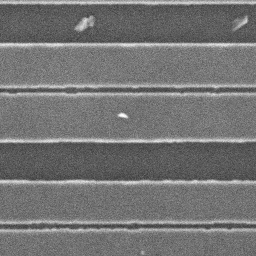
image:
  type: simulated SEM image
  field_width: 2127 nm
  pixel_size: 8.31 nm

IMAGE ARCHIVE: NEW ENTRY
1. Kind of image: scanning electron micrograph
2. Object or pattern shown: lines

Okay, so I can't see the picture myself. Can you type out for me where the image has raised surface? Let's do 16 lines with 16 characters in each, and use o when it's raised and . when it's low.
................
................
................
oooooooooooooooo
oooooooooooooooo
oooooooooooooooo
oooooooooooooooo
oooooooooooooooo
oooooooooooooooo
................
................
oooooooooooooooo
oooooooooooooooo
oooooooooooooooo
oooooooooooooooo
oooooooooooooooo